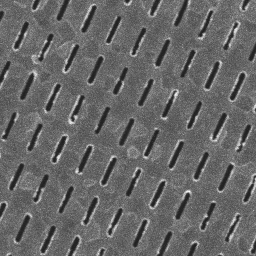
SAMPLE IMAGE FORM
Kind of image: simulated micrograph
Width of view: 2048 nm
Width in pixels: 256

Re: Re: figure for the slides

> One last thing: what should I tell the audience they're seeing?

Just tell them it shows a regular array of holes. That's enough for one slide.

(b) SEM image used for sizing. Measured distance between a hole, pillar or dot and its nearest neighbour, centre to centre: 215 nm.